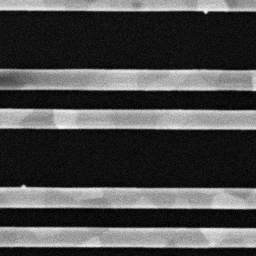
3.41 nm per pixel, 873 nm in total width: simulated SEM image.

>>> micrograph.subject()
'wiring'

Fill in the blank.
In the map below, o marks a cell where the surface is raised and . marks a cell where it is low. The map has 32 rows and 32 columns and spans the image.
oooooooooooooooooooooooooooooooo
................................
................................
................................
................................
................................
................................
................................
................................
oooooooooooooooooooooooooooooooo
oooooooooooooooooooooooooooooooo
................................
................................
................................
oooooooooooooooooooooooooooooooo
oooooooooooooooooooooooooooooooo
................................
................................
................................
................................
................................
................................
................................
................................
oooooooooooooooooooooooooooooooo
oooooooooooooooooooooooooooooooo
................................
................................
................................
oooooooooooooooooooooooooooooooo
oooooooooooooooooooooooooooooooo
................................